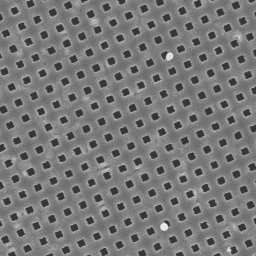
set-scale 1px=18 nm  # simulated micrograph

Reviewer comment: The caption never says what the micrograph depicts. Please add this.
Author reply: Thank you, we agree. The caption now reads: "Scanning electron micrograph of a regular array of holes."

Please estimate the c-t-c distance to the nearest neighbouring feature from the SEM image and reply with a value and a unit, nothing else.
303 nm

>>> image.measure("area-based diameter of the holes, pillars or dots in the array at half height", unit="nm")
142